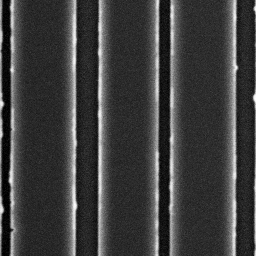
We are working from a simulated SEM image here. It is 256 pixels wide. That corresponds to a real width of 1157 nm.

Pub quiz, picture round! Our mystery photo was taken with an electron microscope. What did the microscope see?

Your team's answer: one or a few lines or trenches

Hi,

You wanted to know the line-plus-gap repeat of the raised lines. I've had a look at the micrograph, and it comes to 361 nanometers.